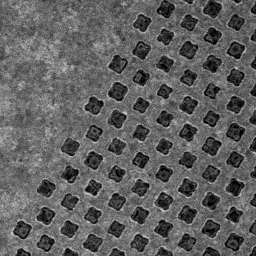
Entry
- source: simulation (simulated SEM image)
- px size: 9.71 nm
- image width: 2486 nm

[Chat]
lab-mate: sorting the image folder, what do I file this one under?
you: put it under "a regular array of holes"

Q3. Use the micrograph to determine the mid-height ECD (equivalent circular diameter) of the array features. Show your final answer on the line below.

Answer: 154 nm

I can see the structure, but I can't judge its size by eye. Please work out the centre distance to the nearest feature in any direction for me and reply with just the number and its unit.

260 nanometers